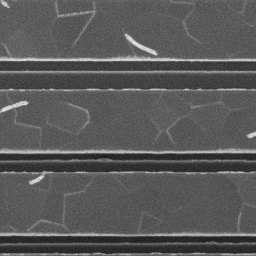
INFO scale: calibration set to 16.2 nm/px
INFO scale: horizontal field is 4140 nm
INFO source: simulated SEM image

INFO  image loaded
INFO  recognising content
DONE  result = lines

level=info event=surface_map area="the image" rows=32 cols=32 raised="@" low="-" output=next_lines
@@@@@@@@@@@@@@@@@@@@@@@@@@@@@@@@
@@@@@@@@@@@@@@@@@@@@@@@@@@@@@@@@
@@@@@@@@@@@@@@@@@@@@@@@@@@@@@@@@
@@@@@@@@@@@@@@@@@@@@@@@@@@@@@@@@
@@@@@@@@@@@@@@@@@@@@@@@@@@@@@@@@
@@@@@@@@@@@@@@@@@@@@@@@@@@@@@@@@
@@@@@@@@@@@@@@@@@@@@@@@@@@@@@@@@
@@@@@@@@@@@@@@@@@@@@@@@@@@@@@@@@
--------------------------------
--------------------------------
--------------------------------
@@@@@@@@@@@@@@@@@@@@@@@@@@@@@@@@
@@@@@@@@@@@@@@@@@@@@@@@@@@@@@@@@
@@@@@@@@@@@@@@@@@@@@@@@@@@@@@@@@
@@@@@@@@@@@@@@@@@@@@@@@@@@@@@@@@
@@@@@@@@@@@@@@@@@@@@@@@@@@@@@@@@
@@@@@@@@@@@@@@@@@@@@@@@@@@@@@@@@
@@@@@@@@@@@@@@@@@@@@@@@@@@@@@@@@
@@@@@@@@@@@@@@@@@@@@@@@@@@@@@@@@
--------------------------------
--------------------------------
-----@--------------------------
@@@@@@@@@@@@@@@@@@@@@@@@@@@@@@@@
@@@@@@@@@@@@@@@@@@@@@@@@@@@@@@@@
@@@@@@@@@@@@@@@@@@@@@@@@@@@@@@@@
@@@@@@@@@@@@@@@@@@@@@@@@@@@@@@@@
@@@@@@@@@@@@@@@@@@@@@@@@@@@@@@@@
@@@@@@@@@@@@@@@@@@@@@@@@@@@@@@@@
@@@@@@@@@@@@@@@@@@@@@@@@@@@@@@@@
--------------------------------
--------------------------------
--------------------------------